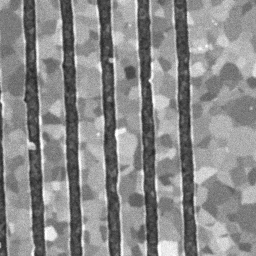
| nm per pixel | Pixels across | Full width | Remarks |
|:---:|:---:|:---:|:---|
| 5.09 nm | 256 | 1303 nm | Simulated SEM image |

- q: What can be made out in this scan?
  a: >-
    parallel lines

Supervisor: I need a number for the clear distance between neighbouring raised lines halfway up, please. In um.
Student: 0.0661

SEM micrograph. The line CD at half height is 25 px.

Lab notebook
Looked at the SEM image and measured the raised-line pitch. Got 193 nanometres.